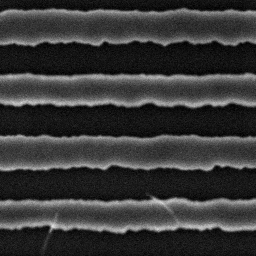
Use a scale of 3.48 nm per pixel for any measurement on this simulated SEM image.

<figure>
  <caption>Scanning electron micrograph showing lines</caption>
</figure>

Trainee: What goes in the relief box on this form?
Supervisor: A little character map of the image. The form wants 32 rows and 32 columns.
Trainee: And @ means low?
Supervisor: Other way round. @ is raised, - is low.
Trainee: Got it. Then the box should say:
--------------------------------
@@@@@@@@@@@@@@@@@@@@@@@@@@@@@@@@
@@@@@@@@@@@@@@@@@@@@@@@@@@@@@@@@
@@@@@@@@@@@@@@@@@@@@@@@@@@@@@@@@
@@@@@@@@@@@@@@@@@@@@@@@@@@@@@@@@
@-@@@------@@-------@-------@@--
--------------------------------
--------------------------------
--------------------------------
@@@@@@-@-@@@@@@@@@@@@@@@--@@@@@@
@@@@@@@@@@@@@@@@@@@@@@@@@@@@@@@@
@@@@@@@@@@@@@@@@@@@@@@@@@@@@@@@@
@@@@@@@@@@@@@@@@@@@@@@@@@@@@@@@@
--------------------------------
--------------------------------
--------------------------------
--------------------------------
@@@@@@@@@@@@@@@@@@@@@@@@@@@@@@@@
@@@@@@@@@@@@@@@@@@@@@@@@@@@@@@@@
@@@@@@@@@@@@@@@@@@@@@@@@@@@@@@@@
@@@@@@@@@@@@@@@@@@@@@@@@@@@@@@@@
--------------------------------
--------------------------------
--------------------------------
--------------------------------
@@@@@@@@@@@@@@@@@@@@@@@@@@@@@@@@
@@@@@@@@@@@@@@@@@@@@@@@@@@@@@@@@
@@@@@@@@@@@@@@@@@@@@@@@@@@@@@@@@
-@@----@@-@@@@@@@@@@@@--@@--@@@@
--------------------------------
--------------------------------
--------------------------------